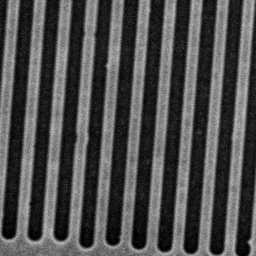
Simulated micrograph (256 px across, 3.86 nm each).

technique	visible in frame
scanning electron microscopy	parallel lines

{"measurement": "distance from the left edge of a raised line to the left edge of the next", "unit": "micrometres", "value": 0.101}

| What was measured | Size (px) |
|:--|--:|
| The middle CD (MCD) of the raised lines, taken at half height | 10.4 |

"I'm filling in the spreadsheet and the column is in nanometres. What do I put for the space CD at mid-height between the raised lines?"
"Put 60.5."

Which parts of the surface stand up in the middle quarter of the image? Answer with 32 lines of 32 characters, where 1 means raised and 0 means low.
00000110000111000011000011100001
00000110000110000011000011100001
00001110000110000011000011100001
00001110000110000111000011000001
00001110000110000111000011000011
00001110000110000111000011000011
00001110000110000111000011000011
00001100000110000111000011000011
00001100000110000110000011000011
00001100001110000110000011000011
00001100001110000110000111000011
00001100001110000110000111000011
00001100001110000110000111000011
00001100001110000110000111000011
00011100001100000110000111000011
00011100001100000110000110000011
00011100001100001110000110000011
00011100001100001110000110000111
00011100001100001110000110000111
00011100001100001110000110000111
00011000001100001110000110000111
00011000011100001100000110000111
00011000011100001100000110000111
00011000011100001100001110000110
00011000011100001100001110000110
00011000011100001100001110000110
00011000011100001100001110000110
00111000011000001100001110000110
00111000011000001100001100000110
00111000011000011100001100000110
00111000011000011100001100001110
00111000011000011100001100001110